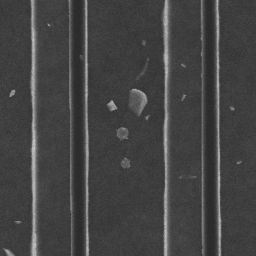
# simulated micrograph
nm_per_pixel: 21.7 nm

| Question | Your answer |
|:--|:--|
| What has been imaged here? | lines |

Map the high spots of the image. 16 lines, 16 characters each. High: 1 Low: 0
0011100000111100
0011100000111100
0011100000111100
0011100000111100
0011100000111100
0011100000111100
0011100000111100
0011100000111100
0011100000111100
0011100000111100
0011100000111100
0011100000111100
0011100000111100
0011100000111100
0011100000111100
0011100000111100